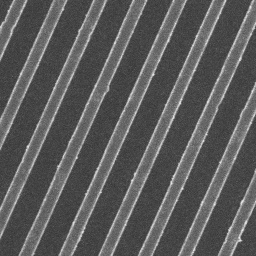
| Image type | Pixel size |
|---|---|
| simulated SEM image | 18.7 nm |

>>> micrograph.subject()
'parallel lines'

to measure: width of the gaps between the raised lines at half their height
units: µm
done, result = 0.443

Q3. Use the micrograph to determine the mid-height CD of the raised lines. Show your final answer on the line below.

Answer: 230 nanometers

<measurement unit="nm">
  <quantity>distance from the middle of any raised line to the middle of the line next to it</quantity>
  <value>679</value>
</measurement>